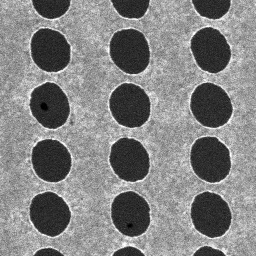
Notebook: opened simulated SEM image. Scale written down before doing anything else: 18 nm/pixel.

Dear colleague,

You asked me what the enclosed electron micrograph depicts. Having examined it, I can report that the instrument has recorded a regular array of holes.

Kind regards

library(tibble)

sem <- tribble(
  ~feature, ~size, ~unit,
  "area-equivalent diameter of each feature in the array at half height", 781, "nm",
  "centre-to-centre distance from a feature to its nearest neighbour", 979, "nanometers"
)